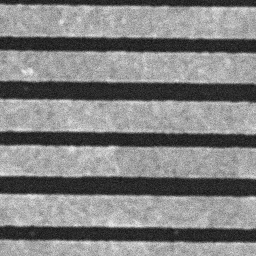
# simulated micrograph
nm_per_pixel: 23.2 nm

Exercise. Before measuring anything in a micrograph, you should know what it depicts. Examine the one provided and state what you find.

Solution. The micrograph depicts wiring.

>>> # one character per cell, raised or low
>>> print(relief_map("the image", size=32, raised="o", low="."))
................................
oooooooooooooooooooooooooooooooo
oooooooooooooooooooooooooooooooo
oooooooooooooooooooooooooooooooo
.....ooo.ooooooooooooooooooooooo
................................
ooooooooo.......................
oooooooooooooooooooooooooooooooo
oooooooooooooooooooooooooooooooo
oooooooooooooooooooooooooooooooo
................................
................................
................................
oooooooooooooooooooooooooooooooo
oooooooooooooooooooooooooooooooo
oooooooooooooooooooooooooooooooo
................o..ooooooooooooo
................................
oooooooooooooooooo.ooo..........
oooooooooooooooooooooooooooooooo
oooooooooooooooooooooooooooooooo
oooooooooooooooooooooooooooooooo
................................
................................
ooooooooooooooo.................
oooooooooooooooooooooooooooooooo
oooooooooooooooooooooooooooooooo
oooooooooooooooooooooooooooooooo
................................
................................
oooooooooooooooooooooooooooooooo
oooooooooooooooooooooooooooooooo